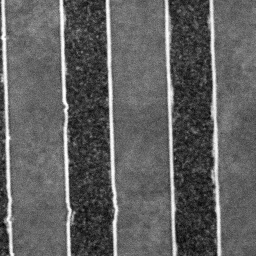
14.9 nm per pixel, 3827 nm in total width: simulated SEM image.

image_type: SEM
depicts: one or a few lines or trenches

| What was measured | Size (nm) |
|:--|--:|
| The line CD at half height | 685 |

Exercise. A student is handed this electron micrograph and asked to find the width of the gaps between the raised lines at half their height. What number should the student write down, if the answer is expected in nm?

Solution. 872